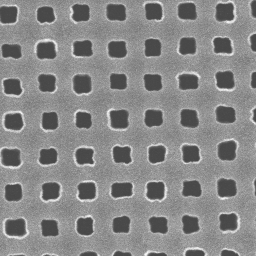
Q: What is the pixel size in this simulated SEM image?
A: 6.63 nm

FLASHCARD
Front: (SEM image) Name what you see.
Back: a regular array of holes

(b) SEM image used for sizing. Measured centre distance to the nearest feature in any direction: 0.228 um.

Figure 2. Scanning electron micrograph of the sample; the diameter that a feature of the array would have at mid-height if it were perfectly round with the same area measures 121 nanometers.